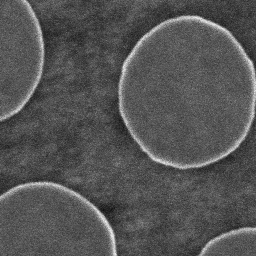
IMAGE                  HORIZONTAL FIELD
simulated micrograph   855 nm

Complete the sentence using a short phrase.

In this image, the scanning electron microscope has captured raised bodies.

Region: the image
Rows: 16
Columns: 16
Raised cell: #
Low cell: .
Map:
##..............
##........###...
###......######.
###.....#######.
###.....########
##.....#########
##.....#########
........########
........#######.
.........#####..
................
..#.............
#####...........
######..........
#######.......##
#######......###